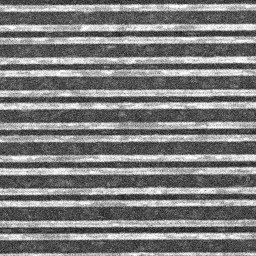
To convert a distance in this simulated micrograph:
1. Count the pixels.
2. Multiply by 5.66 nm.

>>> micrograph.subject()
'parallel lines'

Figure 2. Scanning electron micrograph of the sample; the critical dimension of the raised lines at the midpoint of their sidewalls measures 33.9 nm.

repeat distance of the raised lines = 92.4 nm